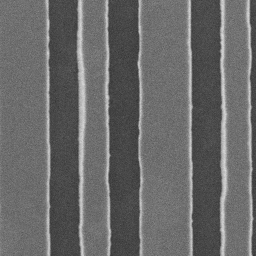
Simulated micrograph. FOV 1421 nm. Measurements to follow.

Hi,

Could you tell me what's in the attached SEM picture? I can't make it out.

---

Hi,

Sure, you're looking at lines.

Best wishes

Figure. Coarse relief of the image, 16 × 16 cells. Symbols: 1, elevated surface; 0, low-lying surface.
1110011001110011
1110011001110011
1110011001110011
1110011001110011
1110011001110011
1110011001110011
1110011001110011
1110011001110011
1110011001110011
1110011001110011
1110011001110011
1110011001110011
1110011001110011
1110011001110011
1110011001110011
1110011001110011